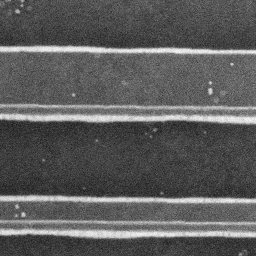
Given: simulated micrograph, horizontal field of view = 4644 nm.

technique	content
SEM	lines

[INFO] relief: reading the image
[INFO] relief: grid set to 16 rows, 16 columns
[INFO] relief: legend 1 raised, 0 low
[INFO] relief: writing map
0000000000000000
0000000000000000
0000000000000000
1111111111111111
1111111111111111
1111111111111111
1111111111111111
0000000000000000
0000000000000000
0000000000000000
0000000000000000
0000000000000000
1111110000000000
1111111111111111
1111111111111111
0000000000000000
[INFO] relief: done